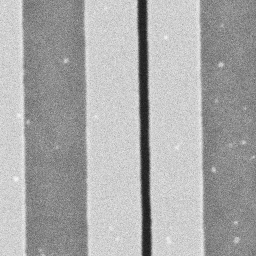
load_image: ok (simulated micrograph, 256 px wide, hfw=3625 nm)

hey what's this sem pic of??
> lines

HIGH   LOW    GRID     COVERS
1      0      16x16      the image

1000011111110000
1000011111110000
1000011111110000
1000011111110000
1000011111110000
1000011111111000
1000011111111000
1000011111111000
1000011111111000
1000001111111000
1000001111111000
1100001111111000
1100001111111000
1100001111111000
1100001111111000
1100001110111000